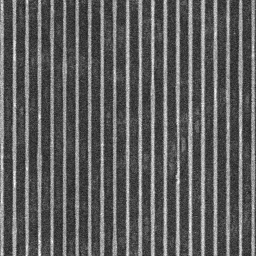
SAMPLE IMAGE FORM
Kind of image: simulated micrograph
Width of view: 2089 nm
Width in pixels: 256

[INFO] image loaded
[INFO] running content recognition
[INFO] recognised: parallel lines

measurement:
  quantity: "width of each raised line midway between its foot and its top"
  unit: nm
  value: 23.5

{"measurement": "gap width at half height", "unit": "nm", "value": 78.5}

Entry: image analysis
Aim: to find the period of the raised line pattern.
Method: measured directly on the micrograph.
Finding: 0.102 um